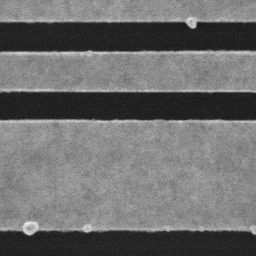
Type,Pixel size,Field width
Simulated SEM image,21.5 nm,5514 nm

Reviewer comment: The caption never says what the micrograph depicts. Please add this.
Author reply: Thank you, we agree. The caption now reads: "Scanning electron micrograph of lines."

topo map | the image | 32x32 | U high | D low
UUUUUUUUUUUUUUUUUUUUUUUUUUUUUUUU
UUUUUUUUUUUUUUUUUUUUUUUUUUUUUUUU
UUUUUUUUUUUUUUUUUUUUUUUUUUUUUUUU
DDDDDDDDDDDDDDDDDDDDDDDDDDDDDDDD
DDDDDDDDDDDDDDDDDDDDDDDDDDDDDDDD
DDDDDDDDDDDDDDDDDDDDDDDDDDDDDDDD
DDDDDDDDDDUUDDDDDDUUUUUUUUUUUUUU
UUUUUUUUUUUUUUUUUUUUUUUUUUUUUUUU
UUUUUUUUUUUUUUUUUUUUUUUUUUUUUUUU
UUUUUUUUUUUUUUUUUUUUUUUUUUUUUUUU
UUUUUUUUUUUUUUUUUUUUUUUUUUUUUUUU
DDDDDDDDDDDDDDDDDDDDDDDDDDUDDDDD
DDDDDDDDDDDDDDDDDDDDDDDDDDDDDDDD
DDDDDDDDDDDDDDDDDDDDDDDDDDDDDDDD
DDDDDDDDDDDDDDDDDDDDDDDDDDDDDDDD
UUUUUUUUUUUUUUUUUUUUUUUUUUUUUUUU
UUUUUUUUUUUUUUUUUUUUUUUUUUUUUUUU
UUUUUUUUUUUUUUUUUUUUUUUUUUUUUUUU
UUUUUUUUUUUUUUUUUUUUUUUUUUUUUUUU
UUUUUUUUUUUUUUUUUUUUUUUUUUUUUUUU
UUUUUUUUUUUUUUUUUUUUUUUUUUUUUUUU
UUUUUUUUUUUUUUUUUUUUUUUUUUUUUUUU
UUUUUUUUUUUUUUUUUUUUUUUUUUUUUUUU
UUUUUUUUUUUUUUUUUUUUUUUUUUUUUUUU
UUUUUUUUUUUUUUUUUUUUUUUUUUUUUUUU
UUUUUUUUUUUUUUUUUUUUUUUUUUUUUUUU
UUUUUUUUUUUUUUUUUUUUUUUUUUUUUUUU
UUUUUUUUUUUUUUUUUUUUUUUUUUUUUUUU
UUUUUUUUUUUUUUUUUUUUUUUUUUUUUUUU
DDDDDDDDDDDDDDDDDDDDDDDDDDDDDDDD
DDDDDDDDDDDDDDDDDDDDDDDDDDDDDDDD
DDDDDDDDDDDDDDDDDDDDDDDDDDDDDDDD